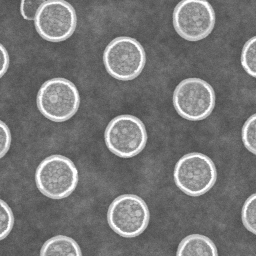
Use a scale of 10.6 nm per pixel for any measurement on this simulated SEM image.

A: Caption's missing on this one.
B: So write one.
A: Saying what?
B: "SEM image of raised bodies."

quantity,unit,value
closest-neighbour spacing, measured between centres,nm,815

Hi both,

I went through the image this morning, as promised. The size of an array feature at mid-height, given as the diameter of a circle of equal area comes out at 427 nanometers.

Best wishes